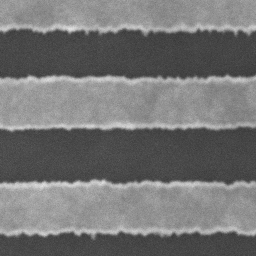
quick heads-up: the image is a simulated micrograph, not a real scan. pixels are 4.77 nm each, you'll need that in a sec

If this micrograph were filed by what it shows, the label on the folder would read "lines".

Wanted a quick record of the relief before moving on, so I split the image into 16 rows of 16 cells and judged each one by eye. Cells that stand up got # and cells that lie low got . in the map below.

################
################
................
................
................
################
################
################
................
................
................
#######.########
################
################
##############.#
................